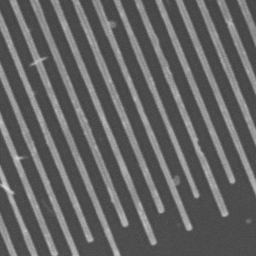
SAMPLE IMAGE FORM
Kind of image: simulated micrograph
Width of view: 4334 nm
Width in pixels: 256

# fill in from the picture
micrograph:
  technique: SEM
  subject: parallel lines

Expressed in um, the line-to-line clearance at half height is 0.235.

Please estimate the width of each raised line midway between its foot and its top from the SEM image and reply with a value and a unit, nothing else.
88.1 nm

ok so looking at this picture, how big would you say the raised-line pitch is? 0.325 um